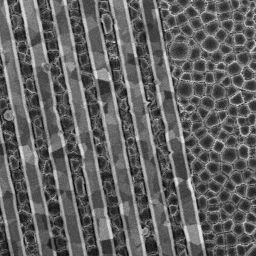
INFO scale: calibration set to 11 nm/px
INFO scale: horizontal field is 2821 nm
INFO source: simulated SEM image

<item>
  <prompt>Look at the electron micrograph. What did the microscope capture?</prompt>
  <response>parallel lines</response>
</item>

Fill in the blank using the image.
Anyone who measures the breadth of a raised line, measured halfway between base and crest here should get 151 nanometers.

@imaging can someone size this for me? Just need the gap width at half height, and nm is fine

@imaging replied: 172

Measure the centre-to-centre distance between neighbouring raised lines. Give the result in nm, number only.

323